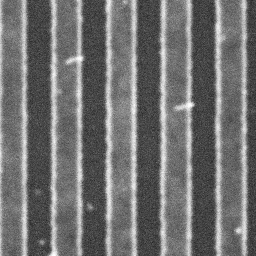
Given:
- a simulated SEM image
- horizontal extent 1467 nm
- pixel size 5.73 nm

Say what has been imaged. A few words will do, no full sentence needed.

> lines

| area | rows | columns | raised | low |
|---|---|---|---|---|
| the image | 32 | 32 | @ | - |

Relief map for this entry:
@@@---@@@@---@@@@---@@@@---@@@@-
@@@----@@@---@@@@---@@@@---@@@@-
@@@----@@@---@@@@---@@@@---@@@@-
@@@----@@@---@@@@---@@@@---@@@@-
@@@----@@@---@@@@---@@@@---@@@@-
@@@----@@@---@@@@---@@@@---@@@@-
@@@----@@@---@@@@---@@@@---@@@@-
@@@----@@@---@@@@---@@@@---@@@@-
@@@----@@@---@@@@---@@@@---@@@@-
@@@---@@@@---@@@@---@@@@---@@@@-
@@@----@@@---@@@@---@@@@---@@@@-
@@@----@@@---@@@@---@@@@---@@@@-
@@@----@@@---@@@@---@@@@---@@@@-
@@@----@@@---@@@@---@@@@---@@@@-
@@@----@@@---@@@@---@@@@---@@@@-
@@@----@@@---@@@@---@@@@---@@@@-
@@@---@@@@---@@@@---@@@@---@@@@-
@@@----@@@---@@@@---@@@@---@@@@-
@@@----@@@---@@@@---@@@@---@@@@-
@@@----@@@---@@@@---@@@@---@@@@-
@@@----@@@---@@@@---@@@@---@@@@-
@@@----@@@---@@@@---@@@@---@@@@-
@@@----@@@---@@@@---@@@@---@@@@-
@@@---@@@@---@@@@---@@@@---@@@@-
@@@----@@@---@@@@---@@@@---@@@@-
@@@----@@@---@@@@---@@@@---@@@@-
@@@----@@@---@@@@---@@@@---@@@@-
@@@---@@@@---@@@@---@@@@---@@@@-
@@@----@@@---@@@@---@@@@---@@@@-
@@@----@@@---@@@@---@@@@---@@@@-
@@@----@@@---@@@@---@@@@---@@@@-
@@@----@@@---@@@@---@@@@---@@@@-